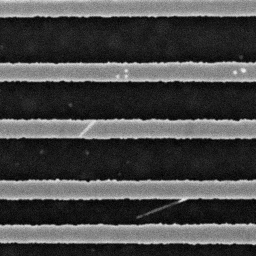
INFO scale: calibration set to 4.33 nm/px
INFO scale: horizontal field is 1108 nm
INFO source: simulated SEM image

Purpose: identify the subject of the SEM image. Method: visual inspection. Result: lines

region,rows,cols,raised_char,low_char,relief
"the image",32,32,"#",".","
################################
################################
................................
................................
................................
................................
................................
................................
################################
################################
................................
................................
................................
................................
................................
################################
################################
................................
................................
................................
................................
................................
................................
################################
################################
................................
................................
................................
################################
################################
...............................#
................................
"